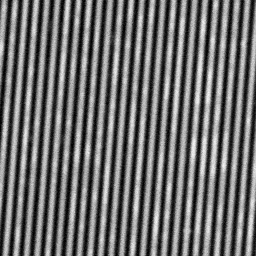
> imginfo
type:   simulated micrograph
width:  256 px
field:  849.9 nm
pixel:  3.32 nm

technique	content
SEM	parallel lines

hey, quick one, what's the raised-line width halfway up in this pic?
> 14.1 nm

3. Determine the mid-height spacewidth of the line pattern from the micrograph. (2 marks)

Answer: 0.0198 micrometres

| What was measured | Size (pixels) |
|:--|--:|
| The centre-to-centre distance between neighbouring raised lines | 10.5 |